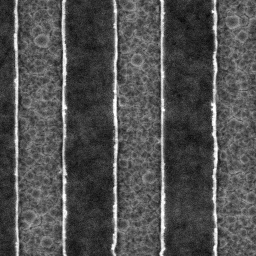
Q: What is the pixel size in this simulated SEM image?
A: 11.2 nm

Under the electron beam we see one or a few lines or trenches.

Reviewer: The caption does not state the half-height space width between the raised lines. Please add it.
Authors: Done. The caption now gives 510 nanometres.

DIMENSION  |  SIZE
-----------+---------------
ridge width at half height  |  599 nm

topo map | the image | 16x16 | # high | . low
#...###...###...
#...###...###...
#...###...####..
#...###...###...
#...###...###...
#...###...###...
#...###...###...
#...###...###...
#...###...###...
#...###...####..
#...###...###...
#...###...###...
#...###...###...
#...###...###...
#...###...####..
#...###...####..